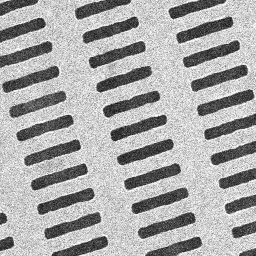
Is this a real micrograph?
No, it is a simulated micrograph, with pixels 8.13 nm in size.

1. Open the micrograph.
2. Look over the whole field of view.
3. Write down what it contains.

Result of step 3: a regular array of holes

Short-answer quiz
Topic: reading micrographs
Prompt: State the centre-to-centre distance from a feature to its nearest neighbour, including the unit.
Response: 0.206 µm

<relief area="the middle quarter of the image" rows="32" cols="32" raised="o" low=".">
oooooo...ooooooooooooooooooooo..
ooooooooooooooooo.....oooooooooo
ooooooooooooooo.......oooooooooo
ooooooooooo.........oooooooooooo
ooooooooo.........oooooooooooooo
oooooooo......oooooooooooooooooo
oooooooo...ooooooooooooooooooooo
oooooooooooooooooooo....oooooooo
.oooooooooooooooo.......oooooooo
ooooooooooooo..........ooooooooo
ooooooooooo........ooooooooooooo
oooooooooo.......ooooooooooooooo
oooooooooo...ooooooooooooooooooo
..ooooooooooooooooooo.....oooooo
..oooooooooooooooo........oooooo
.oooooooooooooo.........oooooooo
oooooooooooo.........ooooooooooo
oooooooooooo......oooooooooooooo
oooooooooooo...ooooooooooooooooo
o...oooooooooooooooooooo...ooooo
....ooooooooooooooooo......ooooo
....ooooooooooooo..........ooooo
.oooooooooooooo.........oooooooo
ooooooooooooo........ooooooooooo
ooooooooooooo....ooooooooooooooo
ooo...oooooooooooooooooooo...ooo
......oooooooooooooooo.......ooo
.....ooooooooooooooo.........ooo
...ooooooooooooo..........oooooo
ooooooooooooooo........ooooooooo
ooooooooooooooo....ooooooooooooo
ooooo..ooooooooooooooooooooo...o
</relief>